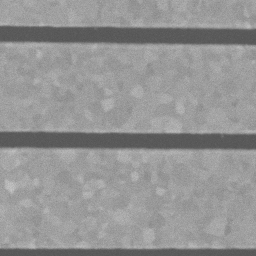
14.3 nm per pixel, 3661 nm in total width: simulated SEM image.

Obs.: lines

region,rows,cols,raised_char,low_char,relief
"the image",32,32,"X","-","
XXXXXXXXXXXXXXXXXXXXXXXXXXXXXXXX
XXXXXXXXXXXXXXXXXXXXXXXXXXXXXXXX
XXXXXXXXXXXXXXXXXXXXXXXXXXXXXXXX
-------------------------XXXXXXX
--------------------------------
XXXXXXXXXXXXXXXXX--XX-----------
XXXXXXXXXXXXXXXXXXXXXXXXXXXXXXXX
XXXXXXXXXXXXXXXXXXXXXXXXXXXXXXXX
XXXXXXXXXXXXXXXXXXXXXXXXXXXXXXXX
XXXXXXXXXXXXXXXXXXXXXXXXXXXXXXXX
XXXXXXXXXXXXXXXXXXXXXXXXXXXXXXXX
XXXXXXXXXXXXXXXXXXXXXXXXXXXXXXXX
XXXXXXXXXXXXXXXXXXXXXXXXXXXXXXXX
XXXXXXXXXXXXXXXXXXXXXXXXXXXXXXXX
XXXXXXXXXXXXXXXXXXXXXXXXXXXXXXXX
XXXXXXXXXXXXXXXXXXXXXXXXXXXXXXXX
----X-XXXXXXXXXXXXXXXXXXXXXXXXXX
--------------------------------
--------------------------------
XXXXXXXXXXXXXXXXXXXXXXXXXXXXXXXX
XXXXXXXXXXXXXXXXXXXXXXXXXXXXXXXX
XXXXXXXXXXXXXXXXXXXXXXXXXXXXXXXX
XXXXXXXXXXXXXXXXXXXXXXXXXXXXXXXX
XXXXXXXXXXXXXXXXXXXXXXXXXXXXXXXX
XXXXXXXXXXXXXXXXXXXXXXXXXXXXXXXX
XXXXXXXXXXXXXXXXXXXXXXXXXXXXXXXX
XXXXXXXXXXXXXXXXXXXXXXXXXXXXXXXX
XXXXXXXXXXXXXXXXXXXXXXXXXXXXXXXX
XXXXXXXXXXXXXXXXXXXXXXXXXXXXXXXX
XXXXXXXXXXXXXXXXXXXXXXXXXXXXXXXX
XXXXXXXXXXXXXXXXXXXXXXXXXXXXXXXX
--------------------------------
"